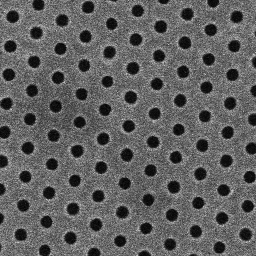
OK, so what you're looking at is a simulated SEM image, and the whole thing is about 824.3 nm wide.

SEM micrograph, a regular array of holes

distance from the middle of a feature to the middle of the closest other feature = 90.9 nanometers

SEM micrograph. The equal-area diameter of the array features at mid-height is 38.4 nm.